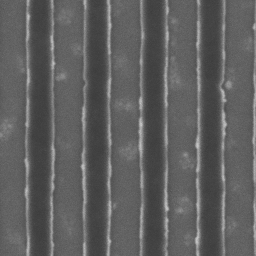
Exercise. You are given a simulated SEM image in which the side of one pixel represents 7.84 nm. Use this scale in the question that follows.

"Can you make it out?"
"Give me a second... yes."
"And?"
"parallel lines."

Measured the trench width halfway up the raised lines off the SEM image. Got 0.237 um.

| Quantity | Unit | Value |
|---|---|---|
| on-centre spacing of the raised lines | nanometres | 446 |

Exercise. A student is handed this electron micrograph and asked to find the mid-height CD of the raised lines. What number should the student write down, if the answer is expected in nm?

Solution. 212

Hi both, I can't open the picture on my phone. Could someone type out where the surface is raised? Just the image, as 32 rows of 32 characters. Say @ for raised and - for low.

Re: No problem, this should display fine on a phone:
---@@@@----@@@----@@@----@@@----
---@@@@----@@@----@@@----@@@----
---@@@@----@@@----@@@----@@@----
---@@@@----@@@----@@@----@@@----
---@@@@----@@@----@@@----@@@----
---@@@@----@@@----@@@----@@@----
---@@@@----@@@----@@@----@@@----
---@@@@----@@@----@@@----@@@----
---@@@@----@@@----@@@----@@@----
---@@@@----@@@----@@@----@@@----
---@@@@----@@@----@@@----@@@----
---@@@@---@@@@----@@@----@@@----
---@@@@----@@@---@@@@----@@@----
---@@@@---@@@@----@@@----@@@----
---@@@@---@@@@----@@@----@@@----
---@@@@---@@@@---@@@@----@@@----
---@@@@---@@@@---@@@@----@@@----
---@@@@---@@@@---@@@@----@@@----
---@@@@---@@@@---@@@@----@@@----
---@@@@---@@@@----@@@----@@@----
---@@@@---@@@@----@@@----@@@----
---@@@@---@@@@----@@@----@@@----
---@@@@---@@@@----@@@----@@@----
---@@@@---@@@@----@@@----@@@----
---@@@@---@@@@----@@@----@@@----
---@@@@---@@@@----@@@----@@@----
---@@@@---@@@@----@@@----@@@----
---@@@@---@@@@----@@@----@@@----
---@@@@---@@@@----@@@----@@@----
---@@@@----@@@----@@@----@@@----
---@@@@---@@@@----@@@---@@@@----
---@@@@---@@@@----@@@----@@@----